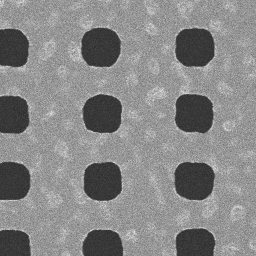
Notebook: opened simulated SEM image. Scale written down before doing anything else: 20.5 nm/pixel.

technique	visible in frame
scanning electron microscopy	holes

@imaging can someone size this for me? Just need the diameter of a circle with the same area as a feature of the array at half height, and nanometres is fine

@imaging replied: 834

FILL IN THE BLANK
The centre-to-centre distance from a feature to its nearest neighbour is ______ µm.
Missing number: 1.36